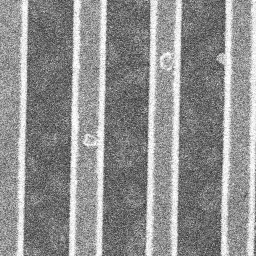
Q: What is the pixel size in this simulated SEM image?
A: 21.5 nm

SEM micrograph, one or a few lines or trenches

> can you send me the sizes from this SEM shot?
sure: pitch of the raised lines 75.9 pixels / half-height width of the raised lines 552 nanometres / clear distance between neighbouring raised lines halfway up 1100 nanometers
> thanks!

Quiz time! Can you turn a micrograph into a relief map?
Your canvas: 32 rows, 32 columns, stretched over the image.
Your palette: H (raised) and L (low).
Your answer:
HHHLLLLLLLHHHLLLLLLHHHLLLLLLLHHH
HHHLLLLLLLHHHLLLLLLHHHLLLLLLLHHH
HHHLLLLLLLHHHLLLLLLHHHLLLLLLLHHH
HHHLLLLLLLHHHLLLLLLHHHLLLLLLLHHH
HHHLLLLLLLHHHLLLLLLHHHLLLLLLLHHH
HHHLLLLLLLHHHLLLLLLHHHLLLLLLLHHH
HHHLLLLLLLHHHLLLLLLHHHLLLLLLLHHH
HHHLLLLLLLHHHLLLLLLHHHLLLLLLLHHH
HHHLLLLLLLHHHLLLLLLHHHLLLLLLLHHH
HHHLLLLLLHHHHLLLLLLHHHLLLLLLHHHH
HHHLLLLLLHHHHLLLLLLHHHLLLLLLHHHH
HHHLLLLLLHHHHLLLLLLHHHLLLLLLHHHH
HHHLLLLLLHHHHLLLLLLHHHLLLLLLHHHH
HHHLLLLLLHHHHLLLLLLHHHLLLLLLHHHH
HHHLLLLLLHHHHLLLLLLHHHLLLLLLHHHH
HHHLLLLLLHHHHLLLLLLHHHLLLLLLHHHH
HHHLLLLLLHHHHLLLLLLHHHLLLLLLHHHH
HHHLLLLLLHHHHLLLLLLHHHLLLLLLHHHH
HHHLLLLLLHHHHLLLLLLHHHLLLLLLHHHH
HHHLLLLLLHHHHLLLLLLHHHLLLLLLHHHH
HHHLLLLLLHHHLLLLLLLHHHLLLLLLHHHL
HHHLLLLLLHHHLLLLLLLHHHLLLLLLHHHL
HHHLLLLLLHHHLLLLLLLHHHLLLLLLHHHL
HHHLLLLLLHHHLLLLLLLHHHLLLLLLHHHL
HHHLLLLLLHHHLLLLLLLHHHLLLLLLHHHL
HHHLLLLLLHHHLLLLLLLHHHLLLLLLHHHL
HHHLLLLLLHHHLLLLLLLHHHLLLLLLHHHL
HHHLLLLLLHHHLLLLLLLHHHLLLLLLHHHL
HHHLLLLLLHHHLLLLLLLHHHLLLLLLHHHL
HHHLLLLLLHHHLLLLLLLHHHLLLLLLHHHL
HHLLLLLLLHHHLLLLLLLHHHLLLLLLHHHL
HHLLLLLLLHHHLLLLLLLHHHLLLLLLHHHL